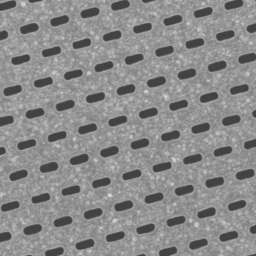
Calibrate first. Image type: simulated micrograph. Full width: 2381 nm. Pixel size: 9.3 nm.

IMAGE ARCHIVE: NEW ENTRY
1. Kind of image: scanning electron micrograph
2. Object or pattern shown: a regular array of holes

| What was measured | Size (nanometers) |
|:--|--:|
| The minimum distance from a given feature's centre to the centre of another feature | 290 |